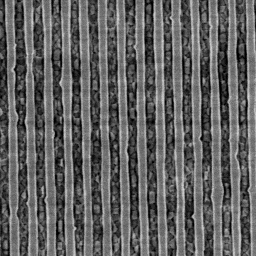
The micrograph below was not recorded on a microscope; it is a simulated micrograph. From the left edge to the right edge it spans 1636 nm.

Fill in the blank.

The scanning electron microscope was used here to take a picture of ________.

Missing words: parallel lines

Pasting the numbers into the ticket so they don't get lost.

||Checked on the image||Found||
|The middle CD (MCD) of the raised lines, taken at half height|48.7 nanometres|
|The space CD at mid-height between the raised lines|70.3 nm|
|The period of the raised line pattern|118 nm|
